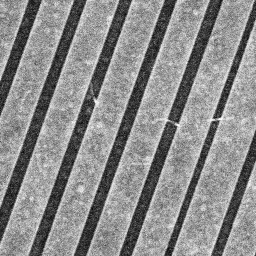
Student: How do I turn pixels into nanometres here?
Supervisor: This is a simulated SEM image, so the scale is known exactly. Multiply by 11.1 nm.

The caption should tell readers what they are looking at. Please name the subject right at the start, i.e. parallel lines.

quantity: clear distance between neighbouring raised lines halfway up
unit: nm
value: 142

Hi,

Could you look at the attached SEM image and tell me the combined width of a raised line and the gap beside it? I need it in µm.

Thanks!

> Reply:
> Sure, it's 0.47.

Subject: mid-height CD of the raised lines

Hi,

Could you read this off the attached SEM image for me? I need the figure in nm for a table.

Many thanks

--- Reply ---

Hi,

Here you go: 332